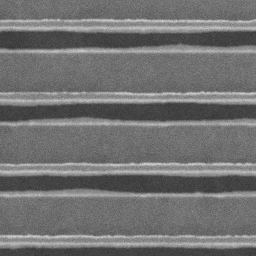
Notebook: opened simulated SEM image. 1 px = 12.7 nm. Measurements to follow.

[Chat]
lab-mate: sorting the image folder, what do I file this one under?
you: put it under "lines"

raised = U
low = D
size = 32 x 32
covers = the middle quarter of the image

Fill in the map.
UUUUUUUUUUUUUUUUUUUUUUUUUUUUUUUU
UUUUUUUUUUUUUUUUUUUUUUUUUUUUUUUU
UUUUUUUUUUUUUUUUUUUUUUUUUUUUUUUU
UUUUUUUUUUUUUUUUUUUUUUUUUUUUUUUU
UUUUUUUUUUUUUUUUUUUUUUUUUUUUUUUU
UUUUUUUUUUUUUUUUUUUUUUUUUUUUUUUU
UUUUUUUUUUUUUUUUUUUUUUUUUUUUUUUU
UUUUUUUUUUUUUUUUUUUUUUUUUUUUUUUU
UUUUUUUUUUUUUUUUUUUUUUUUUUUUUUUU
DDDDDDDDDDDDDDDDDDDDDDDDDDDDDDDD
DDDDDDDDDDDDDDDDDDDDDDDDDDDDDDDD
DDDDDDDDDDDDDDDDDDDDDDDDDDDDDDDD
DDDDDDDDDDDDDDDDDDDDDDDDDDDDDDDD
DDDDDDDDDDDDDDDDDDDDDDDDDDDDDDDD
DDDDDDDDDDDDDDDDDDDDDDDDDDDDDDDD
UUUUUUUUUUUUUUUUUUUUUUUUUUUUUUUU
UUUUUUUUUUUUUUUUUUUUUUUUUUUUUUUU
UUUUUUUUUUUUUUUUUUUUUUUUUUUUUUUU
UUUUUUUUUUUUUUUUUUUUUUUUUUUUUUUU
UUUUUUUUUUUUUUUUUUUUUUUUUUUUUUUU
UUUUUUUUUUUUUUUUUUUUUUUUUUUUUUUU
UUUUUUUUUUUUUUUUUUUUUUUUUUUUUUUU
UUUUUUUUUUUUUUUUUUUUUUUUUUUUUUUU
UUUUUUUUUUUUUUUUUUUUUUUUUUUUUUUU
UUUUUUUUUUUUUUUUUUUUUUUUUUUUUUUU
UUUUUUUUUUUUUUUUUUUUUUUUUUUUUUUU
UUUUUUUUUUUUUUUUUUUUUUUUUUUUUUUU
DDDDDDDDDDDDDDDDDDDDDDDDDDDDDDDD
DDDDDDDDDDDDDDDDDDDDDDDDDDDDDDDD
DDDDDDDDDDDDDDDDDDDDDDDDDDDDDDDD
DDDDDDDDDDDDDDDDDDDDDDDDDDDDDDDD
DDDDDDDDDDDDDDDDDDDDDDDDDDDDDDDD